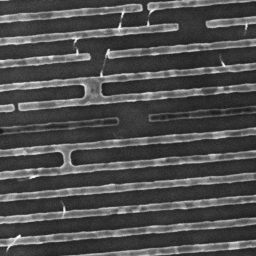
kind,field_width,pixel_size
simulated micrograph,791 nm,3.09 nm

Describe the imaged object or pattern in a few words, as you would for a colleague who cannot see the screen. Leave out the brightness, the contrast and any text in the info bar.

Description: parallel lines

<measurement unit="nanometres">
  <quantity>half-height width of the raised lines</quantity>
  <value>21.6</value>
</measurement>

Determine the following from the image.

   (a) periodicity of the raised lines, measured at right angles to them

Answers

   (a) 68.9 nm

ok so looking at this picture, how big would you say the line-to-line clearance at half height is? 48.9 nm